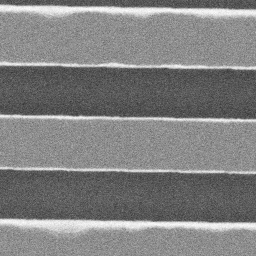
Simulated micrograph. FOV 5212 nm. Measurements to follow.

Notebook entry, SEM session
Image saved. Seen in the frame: lines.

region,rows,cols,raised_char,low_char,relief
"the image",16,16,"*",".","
***.............
****************
****************
****************
................
................
................
**************..
****************
****************
****************
................
................
................
****************
****************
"